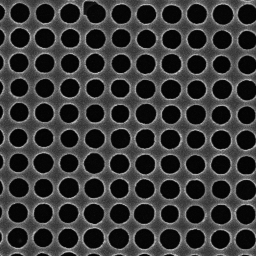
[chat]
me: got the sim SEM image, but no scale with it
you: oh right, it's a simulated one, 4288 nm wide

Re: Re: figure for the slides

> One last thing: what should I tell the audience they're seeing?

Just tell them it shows a regular array of holes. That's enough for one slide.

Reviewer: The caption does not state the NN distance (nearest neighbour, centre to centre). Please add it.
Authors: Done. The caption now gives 413 nm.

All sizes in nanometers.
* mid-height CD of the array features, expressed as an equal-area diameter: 324